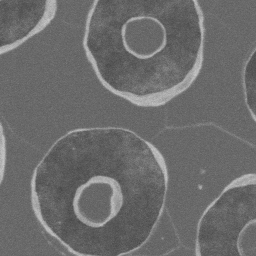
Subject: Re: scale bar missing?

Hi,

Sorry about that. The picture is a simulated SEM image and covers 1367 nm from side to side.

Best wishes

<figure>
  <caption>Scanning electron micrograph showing ring-shaped grooves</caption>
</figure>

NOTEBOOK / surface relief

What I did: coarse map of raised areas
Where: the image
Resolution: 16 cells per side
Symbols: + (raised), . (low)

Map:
...+++......++++
...++...++..++++
..+++...++...+++
++++++..+...++++
++++++......+++.
+++++++....++++.
++++++++++++++++
++++++++++++++++
++++.....+++++++
+++.......++++++
++........++++++
++...++...+++++.
++...++...++++..
+++..++...+++...
+++......+++...+
++++....++++...+